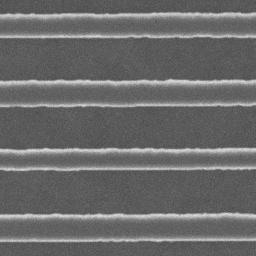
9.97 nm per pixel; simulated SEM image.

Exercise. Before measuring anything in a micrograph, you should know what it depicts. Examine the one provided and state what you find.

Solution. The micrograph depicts lines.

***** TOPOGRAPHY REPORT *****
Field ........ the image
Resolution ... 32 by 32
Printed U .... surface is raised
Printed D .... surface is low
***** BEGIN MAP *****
DDDDDDDDDDDDDDDDDDDDDDDDDDDDDDDD
DDDDDDDDDDDDDDDDDDDDDDDDDDDDDDDD
UUUUUUUUUUUUUUUUUUUUUUUUUUUUUUUU
UUUUUUUUUUUUUUUUUUUUUUUUUUUUUUUU
UUUUUUUUUUUUUUUUUUUUUUUUUUUUUUUU
DDDDDDDDDDDDDDDDDDDDDDDDDDDDDDDD
DDDDDDDDDDDDDDDDDDDDDDDDDDDDDDDD
DDDDDDDDDDDDDDDDDDDDDDDDDDDDDDDD
DDDDDDDDDDDDDDDDDDDDDDDDDDDDDDDD
DDDDDDDDDDDDDDDDDDDDDDDDDDDDDDDD
UUUUUUUUUUUUUUUUUUUUUUUUUUUUUUUU
UUUUUUUUUUUUUUUUUUUUUUUUUUUUUUUU
UUUUUUUUUUUUUUUUUUUUUUUUUUUUUUUU
DDDDDDDDDDDDDDDDDDDDDDDDDDDDDDDD
DDDDDDDDDDDDDDDDDDDDDDDDDDDDDDDD
DDDDDDDDDDDDDDDDDDDDDDDDDDDDDDDD
DDDDDDDDDDDDDDDDDDDDDDDDDDDDDDDD
DDDDDDDDDDDDDDDDDDDDDDDDDDDDDDDD
DDDDDDDDDDDDDDDDDDDDDDDDDDDDDDDD
UUUUUUUUUUUUUUUUUUUUUUUUUUUUUUUU
UUUUUUUUUUUUUUUUUUUUUUUUUUUUUUUU
DDDDDDDDDDDDDDDDDDDDDDDDDDDDDDDD
DDDDDDDDDDDDDDDDDDDDDDDDDDDDDDDD
DDDDDDDDDDDDDDDDDDDDDDDDDDDDDDDD
DDDDDDDDDDDDDDDDDDDDDDDDDDDDDDDD
DDDDDDDDDDDDDDDDDDDDDDDDDDDDDDDD
DDDDDDDDDDDDDDDDDDDDDDDDDDDDDDDD
UUUUUUUUUUUUUUUUUUUUUUUUUUUUUUUU
UUUUUUUUUUUUUUUUUUUUUUUUUUUUUUUU
UUUUUUUUUUUUUUUUUUUUUUUUUUUUUUUU
DDDDDDDDDDDDDDDDDDDDDDDDDDDDDDDD
DDDDDDDDDDDDDDDDDDDDDDDDDDDDDDDD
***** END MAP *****